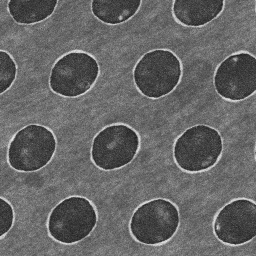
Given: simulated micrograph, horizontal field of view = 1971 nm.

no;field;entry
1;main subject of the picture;holes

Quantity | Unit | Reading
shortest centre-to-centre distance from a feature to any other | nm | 639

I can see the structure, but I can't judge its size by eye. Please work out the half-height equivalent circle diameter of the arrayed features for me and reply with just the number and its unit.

363 nm